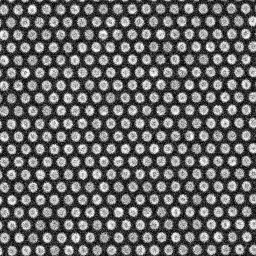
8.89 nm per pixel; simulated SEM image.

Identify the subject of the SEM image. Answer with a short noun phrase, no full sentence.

a regular array of raised bodies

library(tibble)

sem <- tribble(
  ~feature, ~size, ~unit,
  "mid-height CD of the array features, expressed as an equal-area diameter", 77.1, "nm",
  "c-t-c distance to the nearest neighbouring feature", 13.9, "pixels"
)